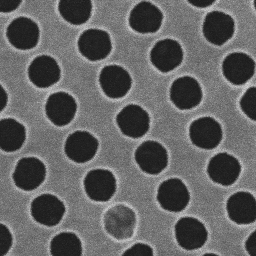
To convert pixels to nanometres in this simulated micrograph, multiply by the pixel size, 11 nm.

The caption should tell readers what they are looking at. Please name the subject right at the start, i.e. a regular array of holes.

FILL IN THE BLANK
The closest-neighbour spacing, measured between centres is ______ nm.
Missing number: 462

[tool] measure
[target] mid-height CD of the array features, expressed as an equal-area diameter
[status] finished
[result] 0.37 um